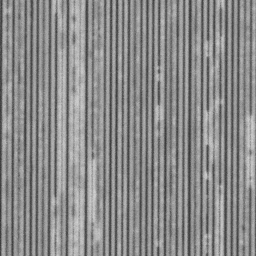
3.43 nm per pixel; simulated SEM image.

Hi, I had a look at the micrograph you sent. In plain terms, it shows parallel lines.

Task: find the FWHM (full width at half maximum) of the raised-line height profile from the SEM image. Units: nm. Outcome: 16.7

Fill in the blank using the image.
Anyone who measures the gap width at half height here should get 6.4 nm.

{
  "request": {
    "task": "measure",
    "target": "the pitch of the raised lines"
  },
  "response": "0.0208 microns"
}